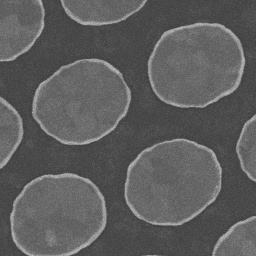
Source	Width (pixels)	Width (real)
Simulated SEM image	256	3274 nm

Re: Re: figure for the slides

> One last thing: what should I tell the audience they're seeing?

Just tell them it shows raised bodies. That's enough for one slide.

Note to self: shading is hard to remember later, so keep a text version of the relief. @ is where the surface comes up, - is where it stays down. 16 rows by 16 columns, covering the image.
@@@-@@@@@-------
@@@-------------
@@--------@@@@@-
@---------@@@@@-
----@@@--@@@@@@-
--@@@@@@--@@@@@-
--@@@@@@---@@---
@-@@@@@---------
@--@@@---------@
@--------@@@@--@
--------@@@@@@-@
--@@@@--@@@@@@--
-@@@@@--@@@@@---
-@@@@@@--@@@----
-@@@@@--------@@
-@@@@---------@@